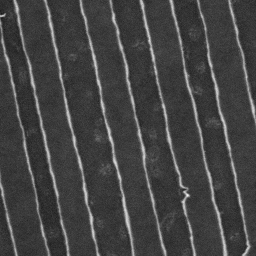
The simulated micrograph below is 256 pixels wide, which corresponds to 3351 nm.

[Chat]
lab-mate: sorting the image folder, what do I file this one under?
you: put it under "parallel lines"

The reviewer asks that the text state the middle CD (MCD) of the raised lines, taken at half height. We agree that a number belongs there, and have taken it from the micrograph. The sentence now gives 394 nm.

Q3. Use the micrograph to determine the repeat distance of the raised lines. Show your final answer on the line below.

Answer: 784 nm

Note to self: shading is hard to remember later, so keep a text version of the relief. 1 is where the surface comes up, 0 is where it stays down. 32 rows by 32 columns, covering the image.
00111100001111000011100001111000
00111100001111000011110001111000
00111100000111000011110001111000
00011100000111100011110000111100
00011110000111100001110000111100
00011110000111100001111000111100
10011110000011100001111000111100
10011110000011110001111000111100
10001111000011110001111000111110
10001111000011110000111000011110
11001111000011110000111100011110
11001111000001110000111100011110
11000111000001111000111100011110
11000111000001111000111100011111
11000111100001111000011110001111
11100111100001111000011110001111
11100111100000111000011110001111
11100011100000111100011110001111
11100011110000111100011110000111
11100011110000111100001111000111
11110011110000111100001111000111
11110011110000011100001111000111
11110001111000011100000111000111
11110001111000011110000111000011
11111001111000011110000111100011
01111001111000001110000111100011
01111001111000001110000111100011
01111000111000001111000111100011
01111000111100001111000011110001
01111100111100001111000011110001
00111100111100001111000011110001
00111100111100000111100011110001